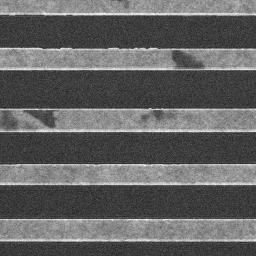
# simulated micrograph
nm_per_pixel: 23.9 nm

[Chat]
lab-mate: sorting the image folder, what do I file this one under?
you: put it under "lines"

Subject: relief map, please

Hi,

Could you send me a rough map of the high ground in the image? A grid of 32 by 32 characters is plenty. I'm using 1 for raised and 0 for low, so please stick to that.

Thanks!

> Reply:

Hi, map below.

11111111111111111111111111111111
11111111111111111111111111111111
00000000000000000000000000000000
00000000000000000000000000000000
00000000000000000000000000000000
00000000000000000000000000000000
11111111111111111111111111111111
11111111111111111111111111111111
11111111111111111111111111111111
00000000000000000000000000000000
00000000000000000000000000000000
00000000000000000000000000000000
00000000000000000000000000000000
00000000000000000000000000000000
11111111111111111111111111111111
11111111111111111111111111111111
00000000000000000000000000000000
00000000000000000000000000000000
00000000000000000000000000000000
00000000000000000000000000000000
00000000000000000000000000000000
11111111111111111111111111111111
11111111111111111111111111111111
00000000000000000000000000000000
00000000000000000000000000000000
00000000000000000000000000000000
00000000000000000000000000000000
11111111111111111111111111111111
11111111111111111111111111111111
11111111111111111111111111111111
00000000000000000000000000000000
00000000000000000000000000000000